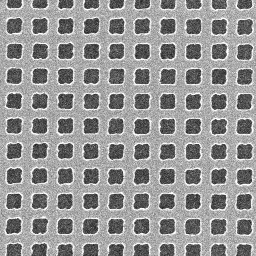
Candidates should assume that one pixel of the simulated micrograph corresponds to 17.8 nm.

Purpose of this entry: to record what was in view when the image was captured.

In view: a regular array of holes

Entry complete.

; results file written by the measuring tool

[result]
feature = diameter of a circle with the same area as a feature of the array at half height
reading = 0.302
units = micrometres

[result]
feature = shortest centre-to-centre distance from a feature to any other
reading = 442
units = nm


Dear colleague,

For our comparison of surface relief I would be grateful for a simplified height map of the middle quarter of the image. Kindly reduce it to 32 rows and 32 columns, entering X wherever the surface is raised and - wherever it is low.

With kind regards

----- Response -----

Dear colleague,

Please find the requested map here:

XXXXXXXXXXXXXXXXXXXXXXXXXXXXXXXX
--XXX----XXX---XXX---XXXX---XXX-
--XXX----XX----XXX----XX----XX--
--XXX----XX----XXX----XX----XX--
--XXX---XXX----XXX---XXX----XX--
XXXXXXXXXXXXXXXXXXXXXXXXXXXXXXXX
XXXXXXXXXXXXXXXXXXXXXXXXXXXXXXXX
--XXX---XXXX---XXX---XXXXX-XXXXX
--XXX----XX----XXX----XX----XXX-
--XXX----XX----XXX----XX----XX--
--XXX----XX----XXX---XXX----XX--
XXXXXXXXXXXXXXXXXXXXXXXXXXXXXXXX
XXXXXXXXXXXXXXXXXXXXXXXXXXXXXXXX
X-XXXXX-XXXX--XXXXXX-XXXXXXXXXXX
--XXX----XX----XXX----XX----XX--
--XXX----XX----XXX----XX----XX--
--XXX----XX----XXX----XX----XX--
-XXXX--XXXX---XXXX---XXXX--XXXX-
XXXXXXXXXXXXXXXXXXXXXXXXXXXXXXXX
XXXXXXXXXXXXXXXXXXXXXXXXXXXXXXXX
--XXX----XX----XXX---XXX----XX--
--XXX----XX----XXX----XX----XX--
--XXX----XX----XX-----XX----XX--
--XXX---XXX----XXX---XXX---XXX--
XXXXXXXXXXXXXXXXXXXXXXXXXXXXXXXX
XXXXXXXXXXXXXXXXXXXXXXXXXXXXXXXX
--XXX----XX----XXX---XXX----XXX-
--XXX----XX----XXX---XXX----XX--
--XXX----XX----XXX---XXX----XX--
--XXX----XX----XXX---XXX----XX--
XXXXXXXXXXXXXXXXXXXXXXXXXXXXXXXX
XXXXXXXXXXXXXXXXXXXXXXXXXXXXXXXX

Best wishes